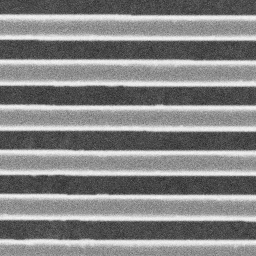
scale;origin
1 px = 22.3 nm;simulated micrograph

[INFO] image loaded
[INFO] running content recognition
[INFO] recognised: lines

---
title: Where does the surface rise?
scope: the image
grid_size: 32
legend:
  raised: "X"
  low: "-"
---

--------------------------------
--------------------------------
XXXXXXXXXXXXXXXXXXXXXXXXXXXXXXXX
XXXXXXXXXXXXXXXXXXXXXXXXXXXXXXXX
XXXXXXXXXXXXXXXXXXXXXXXXXXXXXXXX
--------------------------------
--------------------------------
--------------------------------
XXXXXXXXXXXXXXXXXXXXXXXXXXXXXXXX
XXXXXXXXXXXXXXXXXXXXXXXXXXXXXXXX
XXXXXXXXXXXXXXXXXXXXXXXXXXXXXXXX
--------------------------------
--------------------------------
XXXXXXXXXXXXXXXXXXXXXXXXXXXXXXXX
XXXXXXXXXXXXXXXXXXXXXXXXXXXXXXXX
XXXXXXXXXXXXXXXXXXXXXXXXXXXXXXXX
--------------------------------
--------------------------------
--------------------------------
XXXXXXXXXXXXXXXXXXXXXXXXXXXXXXXX
XXXXXXXXXXXXXXXXXXXXXXXXXXXXXXXX
XXXXXXXXXXXXXXXXXXXXXXXXXXXXXXXX
--------------------------------
--------------------------------
XXXXXXXXXXXXXXXXXXX-------------
XXXXXXXXXXXXXXXXXXXXXXXXXXXXXXXX
XXXXXXXXXXXXXXXXXXXXXXXXXXXXXXXX
-----------------------XXX--XXXX
--------------------------------
--------------------------------
XXXXXXXXXXXXXXXXXXXXXXXXXXXXXXXX
XXXXXXXXXXXXXXXXXXXXXXXXXXXXXXXX